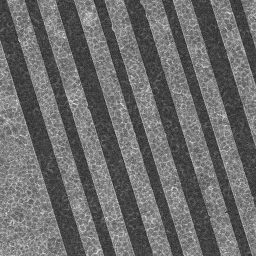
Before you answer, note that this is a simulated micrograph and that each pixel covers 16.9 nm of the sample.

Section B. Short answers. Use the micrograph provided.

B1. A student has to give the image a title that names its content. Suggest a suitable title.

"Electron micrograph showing parallel lines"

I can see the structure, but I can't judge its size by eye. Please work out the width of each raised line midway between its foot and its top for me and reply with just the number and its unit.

270 nm